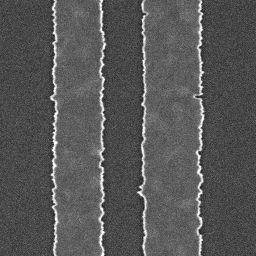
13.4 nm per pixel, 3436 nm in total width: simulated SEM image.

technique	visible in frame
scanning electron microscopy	one or a few lines or trenches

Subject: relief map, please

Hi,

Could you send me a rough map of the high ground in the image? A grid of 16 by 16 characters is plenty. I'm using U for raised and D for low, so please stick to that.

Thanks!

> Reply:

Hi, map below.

DDDUUUDDDUUUUDDD
DDDUUUDDDUUUUDDD
DDDUUUUDDUUUUDDD
DDDUUUDDDUUUUDDD
DDDUUUDDDUUUUDDD
DDDUUUDDDUUUUDDD
DDDUUUDDDUUUUDDD
DDDUUUDDDUUUUDDD
DDDUUUDDDUUUUDDD
DDDUUUDDDUUUDDDD
DDDUUUDDDUUUDDDD
DDDUUUDDDUUUUDDD
DDDUUUDDDUUUDDDD
DDDUUUDDDUUUUDDD
DDDUUUDDDUUUUDDD
DDDUUUDDDUUUUDDD